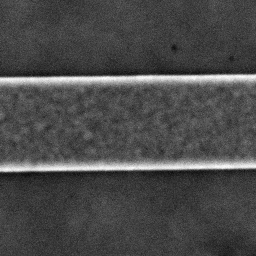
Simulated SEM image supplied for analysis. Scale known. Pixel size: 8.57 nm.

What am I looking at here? wiring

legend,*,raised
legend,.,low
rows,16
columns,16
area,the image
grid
................
................
................
................
................
****************
****************
****************
****************
****************
*************...
................
................
................
................
................